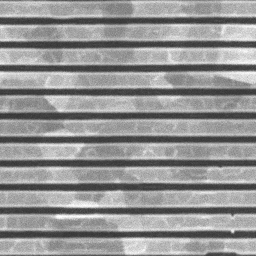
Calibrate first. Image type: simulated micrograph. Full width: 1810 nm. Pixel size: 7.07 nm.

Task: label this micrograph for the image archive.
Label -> parallel lines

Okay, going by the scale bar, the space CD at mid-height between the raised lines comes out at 61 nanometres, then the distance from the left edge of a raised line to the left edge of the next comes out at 0.168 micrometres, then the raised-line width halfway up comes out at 110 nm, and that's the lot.